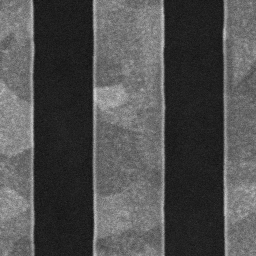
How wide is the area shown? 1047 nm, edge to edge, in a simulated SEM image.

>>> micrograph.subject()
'wiring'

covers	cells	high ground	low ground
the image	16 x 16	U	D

UUDDDDUUUUDDDDUU
UUDDDDUUUUDDDDUU
UUDDDDUUUUDDDDUU
UUDDDDUUUUDDDDUU
UUDDDDUUUUDDDDUU
UUDDDDUUUUDDDDUU
UUDDDDUUUUDDDDUU
UUDDDDUUUUDDDDUU
UUDDDDUUUUDDDDUU
UUDDDDUUUUDDDDUU
UUDDDDUUUUDDDDUU
UUDDDDUUUUDDDDUU
UUDDDDUUUUDDDDUU
UUDDDDUUUUDDDDUU
UUDDDDUUUUDDDDUU
UUDDDDUUUUDDDDUU